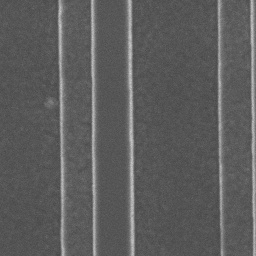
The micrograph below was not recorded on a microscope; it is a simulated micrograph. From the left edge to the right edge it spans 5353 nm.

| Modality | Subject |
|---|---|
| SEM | lines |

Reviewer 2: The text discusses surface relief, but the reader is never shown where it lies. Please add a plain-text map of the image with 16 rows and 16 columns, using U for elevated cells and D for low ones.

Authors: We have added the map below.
DDDDUUUUDDDDDDUU
DDDDUUUUDDDDDDUU
DDDDUUUUDDDDDDUU
DDDDUUUUDDDDDDUU
DDDDUUUUDDDDDDUU
DDDDUUUUDDDDDDUU
DDDDUUUUDDDDDDUU
DDDDUUUUDDDDDDUU
DDDDUUUUDDDDDDUU
DDDDUUUUDDDDDDUU
DDDDUUUUDDDDDDUU
DDDDUUUUDDDDDDUU
DDDDUUUUDDDDDDUU
DDDDUUUUDDDDDDUU
DDDDUUUUDDDDDDUU
DDDDUUUUDDDDDDUU